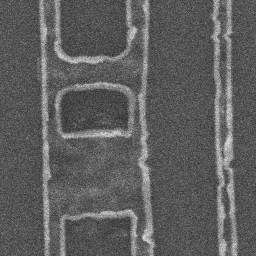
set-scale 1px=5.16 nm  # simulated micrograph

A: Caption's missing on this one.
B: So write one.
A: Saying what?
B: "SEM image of one or a few lines or trenches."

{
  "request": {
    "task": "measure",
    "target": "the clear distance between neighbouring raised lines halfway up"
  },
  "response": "361 nm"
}